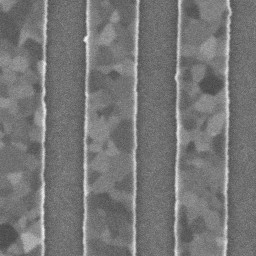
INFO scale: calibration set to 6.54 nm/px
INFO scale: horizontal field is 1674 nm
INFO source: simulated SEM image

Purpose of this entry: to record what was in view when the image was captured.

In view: one or a few lines or trenches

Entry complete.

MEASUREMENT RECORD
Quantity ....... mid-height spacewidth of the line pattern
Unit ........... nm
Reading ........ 266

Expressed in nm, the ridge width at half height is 333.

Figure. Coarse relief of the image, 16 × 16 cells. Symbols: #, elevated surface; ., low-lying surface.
###..####..###..
###..####..###..
###..####..###..
###..####..###..
###..####..###..
###..####..###..
###..####..###..
###..###...###..
###..###...###..
###..###...###..
###..###...###..
###..###...###..
###..###...###..
###..###...###..
###..###...###..
###..###...###..